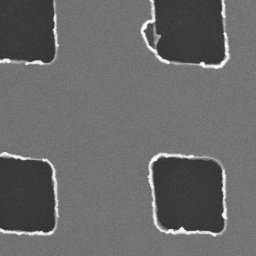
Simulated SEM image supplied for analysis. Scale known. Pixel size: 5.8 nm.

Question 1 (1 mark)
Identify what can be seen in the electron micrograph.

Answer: holes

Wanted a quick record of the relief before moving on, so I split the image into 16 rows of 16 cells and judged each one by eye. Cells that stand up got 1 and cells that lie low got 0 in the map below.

0001111111000011
0001111111000011
0001111111000011
0001111111000011
1111111111111111
1111111111111111
1111111111111111
1111111111111111
1111111111111111
1111111111111111
0001111111000011
0001111111000011
0001111111000011
0001111111000011
1001111111111011
1111111111111111